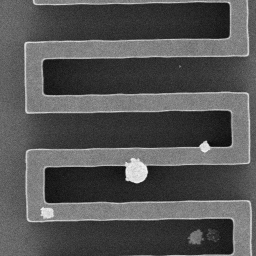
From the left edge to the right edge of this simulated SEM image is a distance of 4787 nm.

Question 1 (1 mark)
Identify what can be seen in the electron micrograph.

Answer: groups of lines, slits or small figures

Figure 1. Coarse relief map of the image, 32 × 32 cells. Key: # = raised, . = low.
.....#####.##...............###.
.............................##.
.............................##.
.............................##.
.............................##.
...############################.
...############################.
...###..........................
...##...........................
...##...........................
...##...........................
...##...........................
...############################.
...############################.
.............................##.
.............................##.
.............................##.
.............................##.
................##..###########.
...############################.
...###########################..
...###..........##..............
...##...........##..............
...##...........................
...###..........................
...###.########################.
...############################.
....######..#................##.
.............................##.
.............................##.
.............................##.
.............................##.